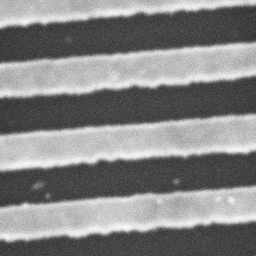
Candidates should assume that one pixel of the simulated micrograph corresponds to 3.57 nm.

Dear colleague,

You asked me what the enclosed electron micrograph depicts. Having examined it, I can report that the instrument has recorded lines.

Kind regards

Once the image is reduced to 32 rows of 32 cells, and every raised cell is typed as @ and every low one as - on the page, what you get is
@@@@@@@@@@@@@@@@@@@@@@@@@@@@@@@@
@@@@@@@@@@@@@@@@@-@@@-----------
@@@@@@@@@@@---------------------
--------------------------------
--------------------------------
-------------------------------@
------------------@@@@@@@@@@@@@@
-----@-@@@@@@@@@@@@@@@@@@@@@@@@@
@@@@@@@@@@@@@@@@@@@@@@@@@@@@@@@@
@@@@@@@@@@@@@@@@@@@@@@@@@@@@@@@-
@@@@@@@@@@@@@@@@@@@@@@@---------
@@@@@@@@@@@---------------------
--------------------------------
--------------------------------
-----------------------------@@@
-------------------@@@@@@@@@@@@@
-----@@@@@@@@@@@@@@@@@@@@@@@@@@@
@@@@@@@@@@@@@@@@@@@@@@@@@@@@@@@@
@@@@@@@@@@@@@@@@@@@@@@@@@@@@@@@@
@@@@@@@@@@@@@@@@@@@-------------
@@@@@@@@@-----------------------
--------------------------------
--------------------------------
------------------------------@@
-----------------@@@@@@@@@@@@@@@
------@@@@@@@@@@@@@@@@@@@@@@@@@@
@@@@@@@@@@@@@@@@@@@@@@@@@@@@@@@@
@@@@@@@@@@@@@@@@@@@@@@@@@@@@@@@@
@@@@@@@@@@@@@@@@@@@-------------
@@@@@@@--@----------------------
--------------------------------
--------------------------------